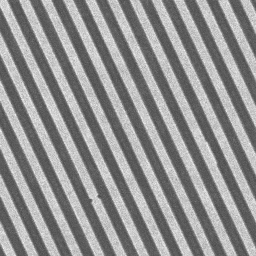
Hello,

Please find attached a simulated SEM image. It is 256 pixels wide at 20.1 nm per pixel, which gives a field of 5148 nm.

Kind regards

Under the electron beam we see parallel lines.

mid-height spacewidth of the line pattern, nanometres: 210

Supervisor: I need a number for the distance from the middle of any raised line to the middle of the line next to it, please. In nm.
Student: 403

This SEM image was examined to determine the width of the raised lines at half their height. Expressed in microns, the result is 0.194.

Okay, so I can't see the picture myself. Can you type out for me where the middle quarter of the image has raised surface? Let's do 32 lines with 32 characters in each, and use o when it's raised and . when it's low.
..ooo...oo...ooo...oo...ooo...oo
..ooo...ooo...oo...ooo...oo...oo
...oo...ooo...ooo..ooo...ooo...o
o..ooo...ooo..ooo...ooo..ooo...o
o...oo...ooo...ooo..ooo...ooo..o
oo..ooo...ooo..ooo...oo...ooo...
oo...oo...ooo...ooo..ooo...ooo..
ooo..ooo...ooo..ooo...oo...ooo..
ooo...oo...ooo...ooo..ooo...ooo.
.oo...ooo...oo...ooo...oo...ooo.
.ooo...oo...ooo...oo...ooo...oo.
..oo...ooo..ooo...ooo...oo...ooo
..ooo...oo...ooo...oo...ooo...oo
...oo...ooo..ooo...ooo...oo...oo
...ooo...oo...ooo..ooo...ooo...o
o..ooo...ooo..ooo...ooo...oo...o
o...oo...ooo...ooo..ooo...ooo...
oo..ooo...oo...ooo...ooo...oo...
oo...oo...ooo...oo...ooo...ooo..
ooo..ooo...oo...ooo...oo...ooo..
ooo...oo...ooo...oo...ooo...ooo.
.ooo..ooo...ooo..ooo...oo...ooo.
.ooo...oo...ooo...oo...ooo...ooo
..oo...ooo...ooo..ooo...oo...ooo
..ooo...oo...ooo...oo...ooo...oo
...oo...ooo...oo...ooo...oo...oo
...ooo...oo...ooo..ooo...ooo..oo
o...oo...ooo..ooo...ooo...oo...o
o...ooo...oo...ooo..ooo...ooo..o
oo..ooo...ooo..ooo...ooo...oo...
oo...ooo..ooo...ooo...oo...ooo..
ooo..ooo...ooo..ooo...ooo...oo..